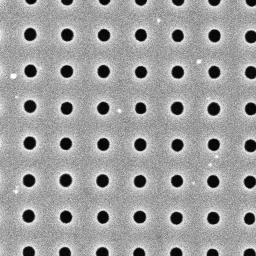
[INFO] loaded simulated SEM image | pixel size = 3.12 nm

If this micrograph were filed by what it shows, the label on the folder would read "a regular array of holes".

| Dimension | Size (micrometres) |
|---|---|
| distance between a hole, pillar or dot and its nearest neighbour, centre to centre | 0.113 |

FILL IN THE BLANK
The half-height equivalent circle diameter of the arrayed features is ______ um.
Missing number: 0.0397